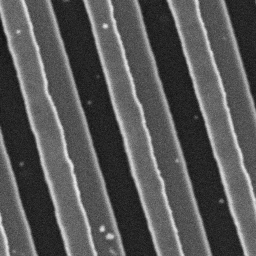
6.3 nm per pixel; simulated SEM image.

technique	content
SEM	lines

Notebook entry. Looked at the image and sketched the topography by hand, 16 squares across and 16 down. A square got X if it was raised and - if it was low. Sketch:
XXX--XXXX--XXX--
XXXX--XXX--XXX--
XXXX--XXX--XXXX-
-XXX--XXXX--XXX-
-XXX---XXX--XXX-
-XXXX--XXX--XXXX
--XXX--XXX--XXXX
--XXX--XXXX--XXX
--XXXX--XXX--XXX
--XXXX--XXX--XXX
X--XXX--XXXX--XX
X--XXXX--XXX--XX
X--XXXX--XXX--XX
XX--XXX--XXX---X
XX--XXX--XXXX--X
XX--XXXX--XXX--X